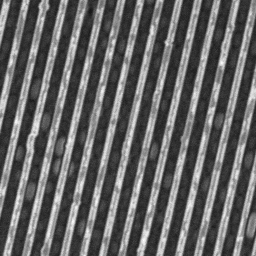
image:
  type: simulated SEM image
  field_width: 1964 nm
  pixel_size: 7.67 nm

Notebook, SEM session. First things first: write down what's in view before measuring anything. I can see parallel lines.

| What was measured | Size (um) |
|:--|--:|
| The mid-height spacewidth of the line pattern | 0.0982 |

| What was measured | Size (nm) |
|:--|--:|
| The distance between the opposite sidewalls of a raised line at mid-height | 45.9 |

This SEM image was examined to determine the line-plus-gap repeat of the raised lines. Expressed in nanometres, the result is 143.